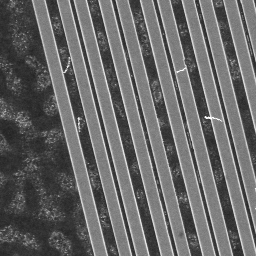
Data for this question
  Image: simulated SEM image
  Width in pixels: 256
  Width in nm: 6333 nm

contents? parallel lines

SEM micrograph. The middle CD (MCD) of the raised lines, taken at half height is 306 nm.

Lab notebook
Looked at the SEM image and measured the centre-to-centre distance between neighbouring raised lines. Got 507 nm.